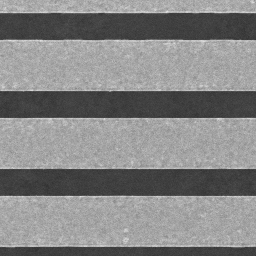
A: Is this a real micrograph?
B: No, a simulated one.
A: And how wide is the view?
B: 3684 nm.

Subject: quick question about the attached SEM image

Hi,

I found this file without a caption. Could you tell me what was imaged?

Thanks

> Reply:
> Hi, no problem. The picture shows wiring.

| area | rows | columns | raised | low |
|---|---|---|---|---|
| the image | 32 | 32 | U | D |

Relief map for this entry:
UUUUUUUUUUUUUUUUUUUUUUUUUUUUUUUU
UUUUUUUUUUUUUUUUUUUUUUDDUDUUUUUU
DDDDDDDDDDDDDDDDDDDDDDDDDDDDDDDD
DDDDDDDDDDDDDDDDDDDDDDDDDDDDDDDD
DDDDDDDDDDDDDDDDDDDDDDDDDDDDDDDD
UUUUUUUUUUUUUUUUUUUUUUUUUUUUUUUU
UUUUUUUUUUUUUUUUUUUUUUUUUUUUUUUU
UUUUUUUUUUUUUUUUUUUUUUUUUUUUUUUU
UUUUUUUUUUUUUUUUUUUUUUUUUUUUUUUU
UUUUUUUUUUUUUUUUUUUUUUUUUUUUUUUU
UUUUUUUUUUUUUUUUUUUUUUUUUUUUUUUU
DDDDDDDDDDDDDDDDDDDDDDDDDDDDDDDD
DDDDDDDDDDDDDDDDDDDDDDDDDDDDDDDD
DDDDDDDDDDDDDDDDDDDDDDDDDDDDDDDD
DDDDDDDDDDDDDDDDDDDDDDDDDDDDDDDD
UUUUUUUUUUUUUUUUUUUUUUUUUUUUUUUU
UUUUUUUUUUUUUUUUUUUUUUUUUUUUUUUU
UUUUUUUUUUUUUUUUUUUUUUUUUUUUUUUU
UUUUUUUUUUUUUUUUUUUUUUUUUUUUUUUU
UUUUUUUUUUUUUUUUUUUUUUUUUUUUUUUU
UUUUUUUUUUUUUUUUUUUUUUUUUUUUUUUU
DDDDDDDDDDDDDDDDDDDDDDDDDDDDDDDD
DDDDDDDDDDDDDDDDDDDDDDDDDDDDDDDD
DDDDDDDDDDDDDDDDDDDDDDDDDDDDDDDD
DDDDDDDDDDDDDDDDDDDDDDDDDDDDDDDD
UUUUUUUUUUUUUUUUUUUUUUUUUUUUUUUU
UUUUUUUUUUUUUUUUUUUUUUUUUUUUUUUU
UUUUUUUUUUUUUUUUUUUUUUUUUUUUUUUU
UUUUUUUUUUUUUUUUUUUUUUUUUUUUUUUU
UUUUUUUUUUUUUUUUUUUUUUUUUUUUUUUU
UUUUUUUUUUUUUUUUUUUUUUUUUUUUUUUU
DDDDDDDDDDDDDDDDDDDDDDDDDDDDDDDD